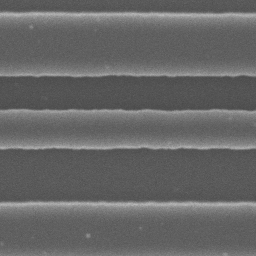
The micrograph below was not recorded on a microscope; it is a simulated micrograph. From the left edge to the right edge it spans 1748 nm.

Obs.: lines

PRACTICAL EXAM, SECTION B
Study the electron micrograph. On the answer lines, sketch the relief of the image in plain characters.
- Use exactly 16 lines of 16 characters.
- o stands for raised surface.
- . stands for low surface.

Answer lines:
................
oooooooooooooooo
oooooooooooooooo
oooooooooooooooo
oooooooooooooooo
................
................
oooooooooooooooo
oooooooooooooooo
................
................
................
................
oooooooooooooooo
oooooooooooooooo
oooooooooooooooo